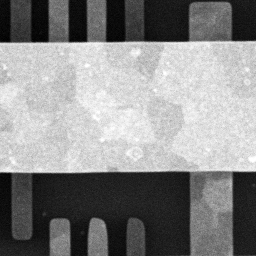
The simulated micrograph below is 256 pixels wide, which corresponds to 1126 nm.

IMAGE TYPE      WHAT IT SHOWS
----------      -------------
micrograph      wiring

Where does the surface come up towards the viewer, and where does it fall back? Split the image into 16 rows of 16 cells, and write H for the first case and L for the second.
LLLLLLLLLLLLLLLL
LLLLLLLLLLLLLLLL
LLLLLLLLLLLLLLLL
HHHHHHHHHHHHHHHH
HHHHHHHHHHHHHHHH
HHHHHHHHHHHHHHHH
HHHHHHHHHHHHHHHH
HHHHHHHHHHHHHHHH
HHHHHHHHHHHHHHHH
HHHHHHHHHHHHHHHH
HHHHHHHHHHHHHHHH
LLLLLLLLLLLLLLLL
LLLLLLLLLLLLLLLL
LLLLLLLLLLLLLLLL
LLLLLLLLLLLLLLLL
LLLLLLLLLLLLLLLL